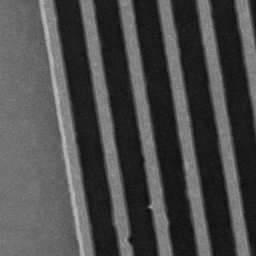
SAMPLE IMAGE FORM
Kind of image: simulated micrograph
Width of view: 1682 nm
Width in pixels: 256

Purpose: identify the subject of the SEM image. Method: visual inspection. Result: parallel lines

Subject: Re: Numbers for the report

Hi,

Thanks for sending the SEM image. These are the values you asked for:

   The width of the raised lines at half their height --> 78.7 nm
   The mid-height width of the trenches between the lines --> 169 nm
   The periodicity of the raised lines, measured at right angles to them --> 253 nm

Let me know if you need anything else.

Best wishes